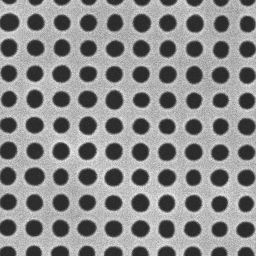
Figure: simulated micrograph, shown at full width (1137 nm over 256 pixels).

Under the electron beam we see a regular array of holes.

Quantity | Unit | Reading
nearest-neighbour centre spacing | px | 25.5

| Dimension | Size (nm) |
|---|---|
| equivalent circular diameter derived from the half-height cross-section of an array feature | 78.4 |